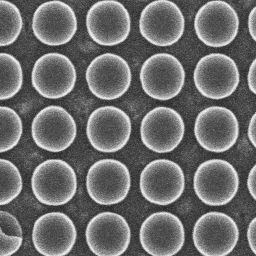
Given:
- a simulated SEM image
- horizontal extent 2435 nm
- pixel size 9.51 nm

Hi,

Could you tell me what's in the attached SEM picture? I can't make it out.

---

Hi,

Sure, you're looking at a regular array of raised bodies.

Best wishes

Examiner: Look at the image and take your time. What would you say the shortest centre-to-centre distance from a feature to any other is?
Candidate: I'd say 0.501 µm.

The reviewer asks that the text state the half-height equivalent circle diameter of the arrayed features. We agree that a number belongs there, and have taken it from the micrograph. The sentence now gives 414 nanometres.